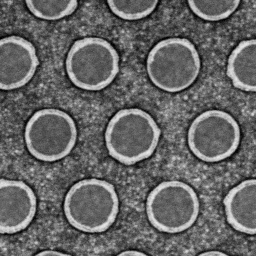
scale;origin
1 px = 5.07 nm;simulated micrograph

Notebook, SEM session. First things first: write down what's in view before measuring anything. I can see raised bodies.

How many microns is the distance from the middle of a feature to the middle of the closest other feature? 0.411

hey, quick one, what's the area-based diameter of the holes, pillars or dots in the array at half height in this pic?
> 262 nm